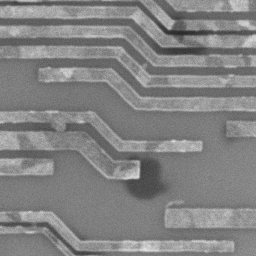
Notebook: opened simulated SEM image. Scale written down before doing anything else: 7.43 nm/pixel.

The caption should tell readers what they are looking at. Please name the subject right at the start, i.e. groups of lines, slits or small figures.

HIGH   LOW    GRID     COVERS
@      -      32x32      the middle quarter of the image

---------------@@@@-------------
@@@@@@@@@@@@----@@@@------------
@@@@@@@@@@@@@----@@@@-----------
@@@@@@@@@@@@@@----@@@@@@@@@@@@@@
-----------@@@@----@@@@@@@@@@@@@
------------@@@@----------------
-------------@@@@---------------
--------------@@@@--------------
---------------@@@@@@-----------
----------------@@@@@@@@@@@@@@@@
-----------------@@@@@@@@@@@@@@@
--------------------------------
@@@@@@@@------------------------
@@@@@@@@@-----------------------
@-----@@@@----------------------
-------@@@@---------------------
---------@@@--------------------
@@@@@@---@@@--------------------
@@@@@@@---@@@@------------------
@@@@@@@@----@@@@@@-------@@@@@@@
@@@@@@@@@---@@@@@@@@@@@@@@@@@@@@
----@@@@@@----@@-@@@@-@@@@@@@@@@
----@@@@@@@---------------------
------@@@@@@--------------------
-------@@@@@@@@@@@@-------------
--------@@@@@@@@@@@-------------
---------@@@@@@@@@@-------------
----------@@@@@@@@@-------------
------------@@@@@@--------------
--------------------------------
--------------------------------
--------------------------------